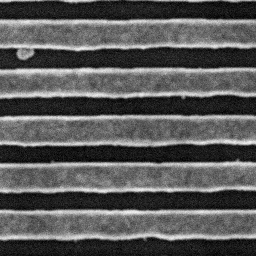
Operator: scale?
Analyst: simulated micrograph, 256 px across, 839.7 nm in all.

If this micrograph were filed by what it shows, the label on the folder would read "lines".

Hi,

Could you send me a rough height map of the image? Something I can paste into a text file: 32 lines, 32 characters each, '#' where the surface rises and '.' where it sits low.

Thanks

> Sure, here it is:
................................
................................
................................
################################
################################
################################
................................
................................
................................
################################
################################
################################
................................
................................
...............###.####...####..
################################
################################
################################
................................
................................
################################
################################
################################
################################
................................
................................
################################
################################
################################
################################
................................
................................